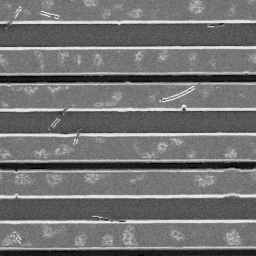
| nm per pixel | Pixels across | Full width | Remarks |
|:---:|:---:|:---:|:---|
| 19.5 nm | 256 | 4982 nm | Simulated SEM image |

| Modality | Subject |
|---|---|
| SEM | parallel lines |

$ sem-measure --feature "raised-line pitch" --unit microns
0.848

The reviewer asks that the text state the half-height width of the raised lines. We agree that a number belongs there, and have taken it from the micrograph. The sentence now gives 516 nm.